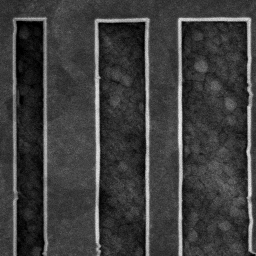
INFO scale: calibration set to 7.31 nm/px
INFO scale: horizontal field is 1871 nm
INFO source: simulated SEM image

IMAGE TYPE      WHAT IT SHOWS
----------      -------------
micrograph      one or a few lines or trenches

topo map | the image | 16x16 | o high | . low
oooooooooooooooo
o..ooo...oo....o
o..ooo...oo.....
o..ooo...oo.....
o..ooo...oo.....
o..ooo...oo.....
o..ooo...oo.....
o..ooo...oo.....
o..ooo...oo.....
o..ooo...oo.....
o..ooo...oo.....
o..ooo...oo.....
o..ooo...oo.....
o..ooo...oo.....
o..ooo...oo.....
o..ooo...oo.....